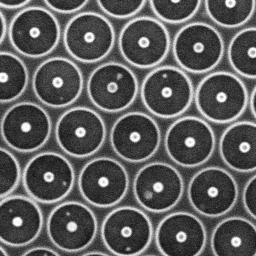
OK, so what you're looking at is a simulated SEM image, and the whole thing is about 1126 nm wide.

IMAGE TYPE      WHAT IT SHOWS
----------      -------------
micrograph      an array of small figures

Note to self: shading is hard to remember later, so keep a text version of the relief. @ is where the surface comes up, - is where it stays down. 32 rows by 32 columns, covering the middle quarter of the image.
---@@@@@@@----@@@@@@-@@@@@@@@@--
---@@@@@--------@@@@@@@@----@@@@
----@@@----------@@@@@-------@@@
----@@@----------@@@@----------@
----@@------------@@-----------@
----@@-----@@-----@@-----------@
----@@-----@@-----@@-----@------
----@@------------@@-----@------
---@@@@----------@@@------------
--@@@@@@---------@@@-----------@
@@@@@@@@@------@@@@@@----------@
@@----@@@@@--@@@@@@@@@--------@@
@-------@@@@@@@@@-@@@@@-----@@@@
---------@@@@@@------@@@@@@@@@@@
---------@@@@---------@@@@@@@---
----------@@@----------@@@@-----
---@@-----@@-----------@@@@-----
---@@-----@@-----@------@@------
----------@@-----@@-----@@------
---------@@@------------@@-----@
---------@@@@----------@@@------
--------@@@@@----------@@@------
@@----@@@@@@@@--------@@@@@-----
@@@@@@@@@@@@@@@@----@@@@@@@-----
-@@@@@@------@@@@@@@@@@@@@@@@---
-@@@@@--------@@@@@@@----@@@@@@@
--@@@----------@@@@@-------@@@@@
--@@-----------@@@@---------@@@@
--@@-----------@@@-----------@@@
--@@-----@@-----@@-----------@@@
--@@------------@@-----@-----@@@
-@@@-----------@@@-----@-----@@-